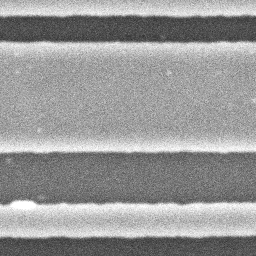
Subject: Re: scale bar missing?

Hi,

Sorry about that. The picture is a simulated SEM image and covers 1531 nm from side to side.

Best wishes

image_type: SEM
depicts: lines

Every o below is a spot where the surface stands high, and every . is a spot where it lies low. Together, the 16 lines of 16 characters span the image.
oooooooooooooooo
................
................
oooooooooooooooo
oooooooooooooooo
oooooooooooooooo
oooooooooooooooo
oooooooooooooooo
oooooooooooooooo
................
................
................
................
oooooooooooooooo
oooooooooooooooo
................